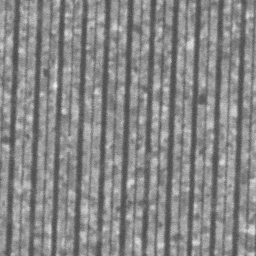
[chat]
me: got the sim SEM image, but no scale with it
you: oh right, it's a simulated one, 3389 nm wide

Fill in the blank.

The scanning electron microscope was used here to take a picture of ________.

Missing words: parallel lines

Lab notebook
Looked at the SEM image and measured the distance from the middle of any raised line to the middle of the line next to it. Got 150 nm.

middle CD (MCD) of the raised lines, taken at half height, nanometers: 84.3